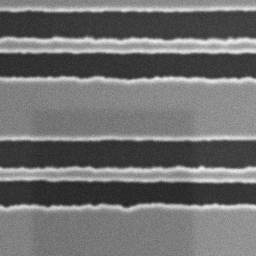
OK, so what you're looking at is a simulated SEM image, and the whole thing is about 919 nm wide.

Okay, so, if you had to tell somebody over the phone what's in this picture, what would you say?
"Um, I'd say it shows lines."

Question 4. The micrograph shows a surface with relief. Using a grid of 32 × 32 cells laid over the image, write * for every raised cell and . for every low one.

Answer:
********************************
................................
................................
................................
................................
********************************
********************************
................................
................................
................................
********************************
********************************
********************************
********************************
********************************
********************************
********************************
**..*********....*.******.*.....
................................
................................
................................
********************************
**.*.***************************
................................
................................
...................*............
********************************
********************************
********************************
********************************
********************************
********************************